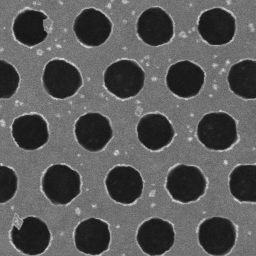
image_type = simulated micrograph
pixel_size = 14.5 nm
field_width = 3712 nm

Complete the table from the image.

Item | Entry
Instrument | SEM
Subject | a regular array of holes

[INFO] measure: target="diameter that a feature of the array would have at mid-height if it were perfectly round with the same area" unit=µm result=0.533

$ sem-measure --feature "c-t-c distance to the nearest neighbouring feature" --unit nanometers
877